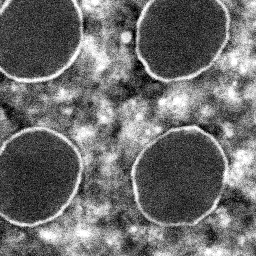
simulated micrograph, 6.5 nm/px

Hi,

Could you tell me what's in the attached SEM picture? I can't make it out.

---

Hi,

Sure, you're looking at raised bodies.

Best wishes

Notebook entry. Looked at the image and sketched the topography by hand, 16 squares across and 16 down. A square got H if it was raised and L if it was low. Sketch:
HHHHHLLLLHHHHHLL
HHHHHLLLLHHHHHLL
HHHHHLLLLHHHHHLL
HHHHHLLLLHHHHHLL
HHHHLLLLLHHHHLLL
LLLLLLLLLLLLLLLL
LLLLLLLLLLLLLLLL
LLLLLLLLLLLLLLLL
LHHHLLLLLLHHHLLL
HHHHHLLLLHHHHHLL
HHHHHLLLHHHHHHLL
HHHHHLLLHHHHHHLL
HHHHLLLLLHHHHHLL
HHHLLLLLLHHHHLLL
LLLLLLLLLLLLLLLL
LLLLLLLLLLLLLLLL